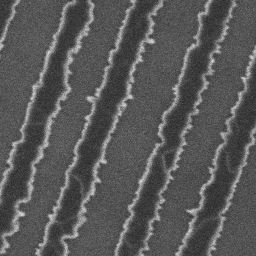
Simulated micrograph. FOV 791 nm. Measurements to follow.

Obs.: one or a few lines or trenches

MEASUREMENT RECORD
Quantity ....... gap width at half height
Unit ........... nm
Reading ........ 113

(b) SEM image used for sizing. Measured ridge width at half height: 0.0833 µm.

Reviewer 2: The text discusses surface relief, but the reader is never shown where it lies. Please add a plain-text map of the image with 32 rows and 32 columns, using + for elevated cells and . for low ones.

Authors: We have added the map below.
++......++++....++++......+++...
++......++++....++++.....++++...
+.......++++....+++......++++...
+......++++....++++......+++....
+......+++.....++++......+++....
.......+++.....+++......+++.....
......+++.....++++.....++++.....
......+++.....++++.....++++....+
......+++....++++......+++.....+
.....++++....++++......+++.....+
.....+++.....+++......++++.....+
....+++++...++++......+++.....++
....++++...+++++......+++.....++
...++++.....+++......++++....+++
...++++....++++.....++++.....+++
...+++.....++++.....++++....++++
...+++....++++......+++.....++++
...+++....++++......+++.....++++
..++++...++++......++++....++++.
.++++....++++......+++.....++++.
.++++....+++......++++.....++++.
.+++....++++......+++.....++++..
++++....++++......+++.....++++..
++++....++++.....++++....++++...
++++....+++......+++.....++++...
++.....++++.....++++.....++++...
+++....+++......++++....++++....
++....++++......++++....++++....
++....++++......+++.....++++....
+.....+++......++++....++++.....
+....+++.......+++.....++++.....
.....+++......++++....++++......